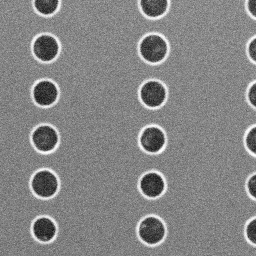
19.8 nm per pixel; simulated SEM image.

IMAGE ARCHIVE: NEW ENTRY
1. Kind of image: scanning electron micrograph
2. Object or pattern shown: a regular array of holes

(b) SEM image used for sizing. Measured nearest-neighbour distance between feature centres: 896 nm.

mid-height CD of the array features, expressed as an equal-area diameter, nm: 525